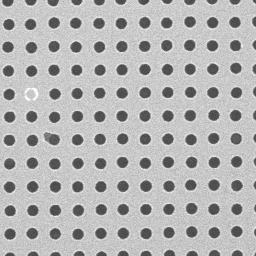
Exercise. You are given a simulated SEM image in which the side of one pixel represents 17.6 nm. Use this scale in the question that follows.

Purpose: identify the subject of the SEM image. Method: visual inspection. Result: a regular array of holes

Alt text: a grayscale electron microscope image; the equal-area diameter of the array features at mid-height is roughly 207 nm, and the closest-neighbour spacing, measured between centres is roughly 22.3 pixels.